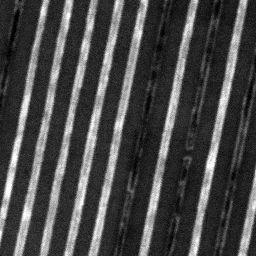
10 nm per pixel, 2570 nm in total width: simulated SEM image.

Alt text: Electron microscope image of parallel lines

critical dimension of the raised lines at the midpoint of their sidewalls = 6.01 pixels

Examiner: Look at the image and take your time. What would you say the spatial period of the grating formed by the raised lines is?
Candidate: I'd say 244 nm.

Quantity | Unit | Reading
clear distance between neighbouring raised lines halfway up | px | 18